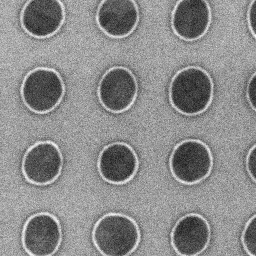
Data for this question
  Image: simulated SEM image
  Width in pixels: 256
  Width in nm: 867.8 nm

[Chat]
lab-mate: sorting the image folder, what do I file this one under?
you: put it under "raised bodies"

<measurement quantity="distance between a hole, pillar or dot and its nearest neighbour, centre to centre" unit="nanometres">247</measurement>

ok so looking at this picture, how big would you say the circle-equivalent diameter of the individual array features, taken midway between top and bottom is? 42.6 pixels